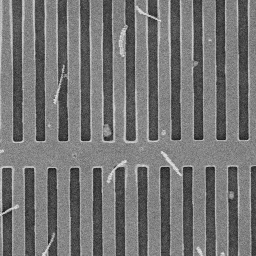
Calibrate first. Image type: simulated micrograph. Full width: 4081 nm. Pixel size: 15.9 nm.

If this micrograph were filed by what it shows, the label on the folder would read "groups of lines, slits or small figures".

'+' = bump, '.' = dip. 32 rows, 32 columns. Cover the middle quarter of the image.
.+++...+++..+++...+++...++...+++
.+++...+++..+++...+++...++...+++
.+++...+++..+++...+++...++...+++
.+++...+++..+++...+++...++...+++
.+++...+++..+++...+++...+++..+++
.+++...+++..+++...+++...+++..+++
.+++...+++..+++...+++...+++..+++
.+++...+++..+++...+++...+++..+++
.+++...+++..+++...+++...+++..+++
.+++...+++..+++...+++...+++..+++
.+++...+++...++...+++...+++..+++
.+++...+++...++...+++...+++..+++
.+++...+++...++...+++...+++..+++
.+++...+++...++...+++...+++..+++
.+++...+++...++...+++...+++..+++
.+++...+++...++...+++...+++..+++
.+++...++++..++...+++...+++..+++
.+++...++++..++...+++...+++..+++
.+++...+++...++...+++...+++..+++
+++++++++++.++++..++++++++++++++
++++++++++++++++++++++++++++++++
++++++++++++++++++++++++++++++++
++++++++++++++++++++++++++++++++
++++++++++++++++++++++++++++++++
++++++++++++++++++++++++++++++++
++++++++++++++.+++...++++.++++..
+...+++...+++...++...+++...++...
+...+++...++....++...+++...++...
+...+++...++...+++...+++...++...
+...+++...++...+++...+++...++...
+...+++...+++..+++...+++...++...
+...+++...+++..+++...+++...++...